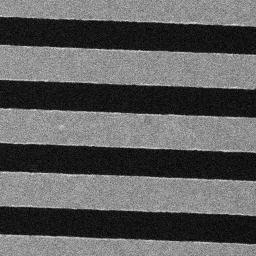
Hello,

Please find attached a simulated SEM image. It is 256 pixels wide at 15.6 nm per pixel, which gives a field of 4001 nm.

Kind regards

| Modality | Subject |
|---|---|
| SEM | parallel lines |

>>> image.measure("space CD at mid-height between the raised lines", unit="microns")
0.447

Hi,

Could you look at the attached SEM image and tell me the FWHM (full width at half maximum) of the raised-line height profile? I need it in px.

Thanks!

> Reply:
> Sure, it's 34.4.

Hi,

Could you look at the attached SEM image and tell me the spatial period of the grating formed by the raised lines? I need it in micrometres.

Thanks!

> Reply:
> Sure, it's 0.986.